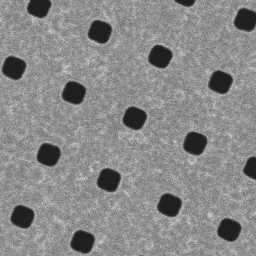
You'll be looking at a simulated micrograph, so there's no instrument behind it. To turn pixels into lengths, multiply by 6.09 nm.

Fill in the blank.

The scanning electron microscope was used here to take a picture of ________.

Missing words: a regular array of holes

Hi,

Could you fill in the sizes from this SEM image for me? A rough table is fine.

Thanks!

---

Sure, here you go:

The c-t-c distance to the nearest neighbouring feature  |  397 nanometers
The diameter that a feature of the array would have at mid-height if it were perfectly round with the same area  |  23.1 px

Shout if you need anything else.